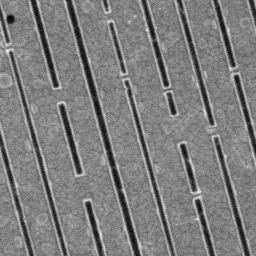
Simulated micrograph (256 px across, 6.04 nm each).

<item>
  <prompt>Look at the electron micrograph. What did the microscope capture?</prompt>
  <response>parallel lines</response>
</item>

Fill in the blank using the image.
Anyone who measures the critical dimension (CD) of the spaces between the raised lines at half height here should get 163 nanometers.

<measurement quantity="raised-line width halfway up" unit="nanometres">44.5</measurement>